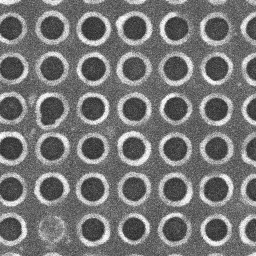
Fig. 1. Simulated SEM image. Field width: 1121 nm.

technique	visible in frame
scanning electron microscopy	a regular array of holes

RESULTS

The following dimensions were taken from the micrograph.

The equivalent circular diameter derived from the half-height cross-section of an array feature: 106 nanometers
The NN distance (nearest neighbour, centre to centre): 40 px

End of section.